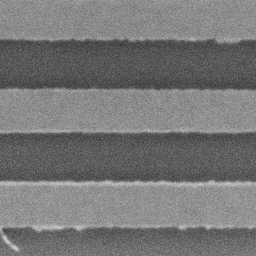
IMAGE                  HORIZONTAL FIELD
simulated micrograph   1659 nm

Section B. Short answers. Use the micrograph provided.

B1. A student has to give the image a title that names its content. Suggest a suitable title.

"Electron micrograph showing lines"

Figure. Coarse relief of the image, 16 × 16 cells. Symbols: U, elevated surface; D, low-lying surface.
UUUUUUUUUUUUUUUU
UUUUUUUUUUUUUUUU
DDDDDDDDDDDDDDDD
DDDDDDDDDDDDDDDD
DDDDDDDDDDDDDDDD
DDDDDDDDDDDDDDDD
UUUUUUUUUUUUUUUU
UUUUUUUUUUUUUUUU
DDDDDDDDDDDDDDDD
DDDDDDDDDDDDDDDD
DDDDDDDDDDDDDDDD
UUUUUUUUUUUUUUUU
UUUUUUUUUUUUUUUU
UUUUUUUUUUUUUUUU
DDDDDDDDDDDDDDDD
DDDDDDDDDDDDDDDD